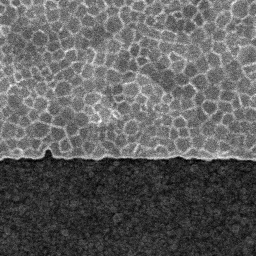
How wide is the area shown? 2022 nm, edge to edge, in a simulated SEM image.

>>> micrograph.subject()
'one or a few lines or trenches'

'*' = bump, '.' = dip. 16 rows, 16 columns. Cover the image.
****************
****************
****************
****************
****************
****************
****************
****************
****************
****************
................
................
................
................
................
................